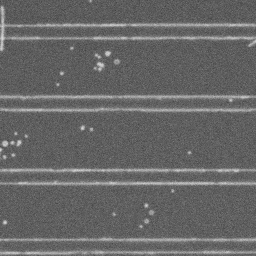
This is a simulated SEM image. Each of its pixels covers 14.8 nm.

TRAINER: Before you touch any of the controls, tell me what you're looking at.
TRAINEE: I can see lines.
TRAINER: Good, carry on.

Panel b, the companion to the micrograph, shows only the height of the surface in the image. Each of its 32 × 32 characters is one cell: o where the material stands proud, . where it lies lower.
................................
................................
................................
oooooooooooooooooooooooooooooooo
oooooooooooooooooooooooooooooooo
................................
................................
................................
................................
................................
................................
................................
oooooooooooooooooooooooooooooooo
oooooooooooooooooooooooooooooooo
................................
................................
................................
................................
................................
................................
................................
oooooooooooooooooooooooooooooooo
oooooooooooooooooooooooooooooooo
................................
................................
................................
................................
................................
................................
................................
oooooooooooooooooooooooooooooooo
oooooooooo..oooooooooooooo..oooo